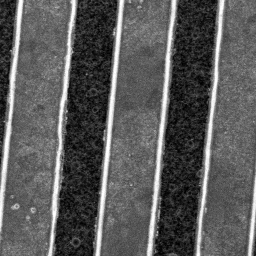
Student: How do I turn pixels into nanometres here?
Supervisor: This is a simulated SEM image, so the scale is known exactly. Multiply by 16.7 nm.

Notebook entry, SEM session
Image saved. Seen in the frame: one or a few lines or trenches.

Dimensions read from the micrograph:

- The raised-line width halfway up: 883 nm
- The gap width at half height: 802 nanometers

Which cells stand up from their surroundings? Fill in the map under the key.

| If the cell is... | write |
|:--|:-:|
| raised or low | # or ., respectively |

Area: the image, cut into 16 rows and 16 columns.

.####...###...##
.###...####...##
.###...####...##
.###...####...##
.###...###....##
.###...###...###
.###...###...###
.###...###...###
.###...###...###
####...###...###
####...###...###
####..####...###
###...####...###
###...####...###
###...###...####
###...###...####